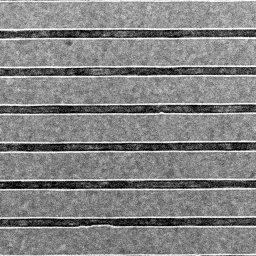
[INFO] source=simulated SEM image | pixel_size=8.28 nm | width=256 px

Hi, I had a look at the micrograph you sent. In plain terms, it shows parallel lines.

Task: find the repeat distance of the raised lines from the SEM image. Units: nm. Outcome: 312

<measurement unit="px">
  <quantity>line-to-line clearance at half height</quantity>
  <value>9.37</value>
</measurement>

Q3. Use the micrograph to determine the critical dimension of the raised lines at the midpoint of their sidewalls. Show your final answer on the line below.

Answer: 28.2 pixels